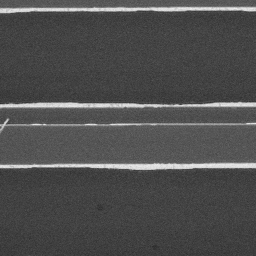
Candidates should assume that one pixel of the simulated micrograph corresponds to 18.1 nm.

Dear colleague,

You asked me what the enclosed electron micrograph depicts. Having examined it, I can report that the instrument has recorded lines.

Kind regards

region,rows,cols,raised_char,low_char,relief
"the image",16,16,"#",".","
################
................
................
................
................
................
................
################
################
################
................
................
................
................
................
................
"